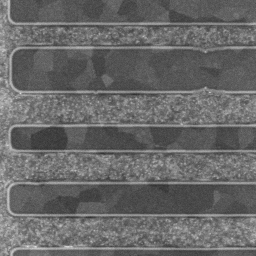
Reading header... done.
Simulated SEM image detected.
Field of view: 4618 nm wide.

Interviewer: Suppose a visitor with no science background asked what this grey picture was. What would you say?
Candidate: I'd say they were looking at one or a few lines or trenches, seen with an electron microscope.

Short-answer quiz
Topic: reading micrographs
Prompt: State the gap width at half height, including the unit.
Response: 588 nanometres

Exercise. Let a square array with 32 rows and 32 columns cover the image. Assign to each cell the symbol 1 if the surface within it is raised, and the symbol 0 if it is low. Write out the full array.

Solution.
01111111111111111111111111111111
01111111111111111111111111111111
01111111111111111111111111111111
00000000000000000000000000000000
00000000000000000000000000000000
00000000000000000000000000000000
00111111111111111111111111111111
01111111111111111111111111111111
01111111111111111111111111111111
01111111111111111111111111111111
01111111111111111111111111111111
00000000000110000000000000000000
00000000000000000000000000000000
00000000000000000000000000000000
00000000000000000000000000000000
00000000000000000000000000000000
01111111111111111111111111111111
01111111111111111111111111111111
01111111111111111111111111111111
00000000000000000000000000000000
00000000000000000000000000000000
00000000000000000000000000000000
00000000000000000000000000000000
01111111111111111111111111111111
01111111111111111111111111111111
01111111111111111111111111111111
01111111111111111111111111111111
00000000000000000000000000000000
00000000000000000000000000000000
00000000000000000000000000000000
00000000000000000000000000000000
00111111111111111111111111111111